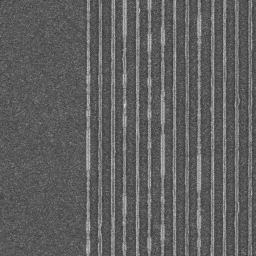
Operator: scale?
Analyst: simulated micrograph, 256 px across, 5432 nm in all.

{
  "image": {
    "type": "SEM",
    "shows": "parallel lines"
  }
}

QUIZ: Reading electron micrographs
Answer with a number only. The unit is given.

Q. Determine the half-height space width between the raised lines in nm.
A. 204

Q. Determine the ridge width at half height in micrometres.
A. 0.0424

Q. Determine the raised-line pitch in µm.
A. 0.265